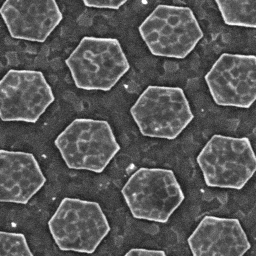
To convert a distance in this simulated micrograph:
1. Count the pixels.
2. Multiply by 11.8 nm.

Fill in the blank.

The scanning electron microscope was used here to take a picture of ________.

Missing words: raised bodies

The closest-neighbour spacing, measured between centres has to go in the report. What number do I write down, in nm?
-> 949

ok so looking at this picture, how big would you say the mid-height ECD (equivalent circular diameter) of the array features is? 649 nanometers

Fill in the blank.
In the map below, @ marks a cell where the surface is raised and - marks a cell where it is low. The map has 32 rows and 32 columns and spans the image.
-@@@@@@----@@@@------------@@@@@
@@@@@@@------------@@@@@----@@@@
-@@@@@@-----------@@@@@@----@@@@
-@@@@@@-----------@@@@@@@-------
--@@@@------------@@@@@@@-------
----------@@@@@---@@@@@@--------
---------@@@@@@----@@@@@--------
--------@@@@@@@@-----------@@@@@
---------@@@@@@@-----------@@@@@
-@@@@----@@@@@@-----------@@@@@@
@@@@@@----@@@@------------@@@@@@
@@@@@@------------@@@@@----@@@@@
@@@@@@-----------@@@@@@----@@@@@
@@@@@@-----------@@@@@@@--------
@@@@@------------@@@@@@@--------
---------@@@@----@@@@@@---------
--------@@@@@@----@@@@@---------
-------@@@@@@@------------@@@@@-
-------@@@@@@@@-----------@@@@@-
@@@@----@@@@@@-----------@@@@@@@
@@@@@---@@@@@------------@@@@@@@
@@@@@------------@@@@----@@@@@@@
@@@@@-----------@@@@@@----@@@@@-
@@@@@----------@@@@@@@----------
@@@@------------@@@@@@@---------
--------@@@@----@@@@@@----------
-------@@@@@@---@@@@@@----------
------@@@@@@@------@@----@@@@---
------@@@@@@@@-----------@@@@@--
@@@----@@@@@@-----------@@@@@@@-
@@@----@@@@@------------@@@@@@@-
@@@@------------@@@@----@@@@@@@-